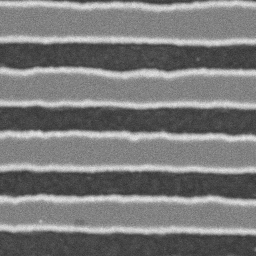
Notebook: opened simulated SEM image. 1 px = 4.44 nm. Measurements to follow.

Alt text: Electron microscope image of lines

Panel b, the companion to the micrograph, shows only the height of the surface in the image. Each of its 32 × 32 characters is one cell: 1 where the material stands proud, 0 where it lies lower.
11111111111111111100001111111111
11111111111111111111111111111111
11111111111111111111111111111111
11111111111111111111111111111111
11111111111111111111111111111111
00000000000000000000001111111000
00000000000000000000000000000000
00000000000000000000000000000000
10001111111000000000000000000000
11111111111111111111111111111111
11111111111111111111111111111111
11111111111111111111111111111111
11111111111111111111111111111111
00000000000000001111000001000111
00000000000000000000000000000000
00000000000000000000000000000000
11111011111100010000000000000000
11111111111111111111111111111111
11111111111111111111111111111111
11111111111111111111111111111111
11111111111111111111111111111111
00000000000000000000000001111111
00000000000000000000000000000000
00000000000000000000000000000000
10011110000111111110000000100000
11111111111111111111111111111111
11111111111111111111111111111111
11111111111111111111111111111111
11111111111111111111111111111111
00000000000000000000000000000000
00000000000000000000000000000000
00000000000000000000000000000000